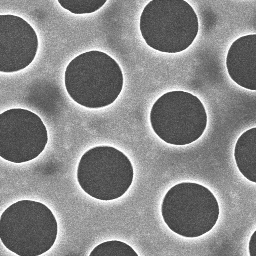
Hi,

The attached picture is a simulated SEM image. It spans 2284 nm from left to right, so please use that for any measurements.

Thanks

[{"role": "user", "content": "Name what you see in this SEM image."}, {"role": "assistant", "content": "holes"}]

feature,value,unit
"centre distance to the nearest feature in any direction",823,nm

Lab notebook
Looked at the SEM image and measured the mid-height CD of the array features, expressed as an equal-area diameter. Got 500 nanometers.